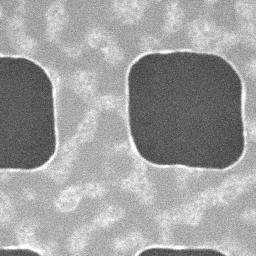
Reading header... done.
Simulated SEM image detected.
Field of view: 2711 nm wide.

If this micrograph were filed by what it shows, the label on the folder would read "holes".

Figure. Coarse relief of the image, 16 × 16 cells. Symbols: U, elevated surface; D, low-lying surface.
UUUUUUUUUUUUUUUU
UUUUUUUUUUUUUUUU
UUUUUUUUUUUUUUUU
UUUUUUUUUDDDDDUU
DDDUUUUUDDDDDDDU
DDDUUUUUDDDDDDDU
DDDUUUUUDDDDDDDU
DDDUUUUUDDDDDDDU
DDDUUUUUDDDDDDDU
DDDUUUUUUDDDDDDU
DDUUUUUUUUUUDDUU
UUUUUUUUUUUUUUUU
UUUUUUUUUUUUUUUU
UUUUUUUUUUUUUUUU
UUUUUUUUUUUUUUUU
DUUUUUUUUDDDDUUU